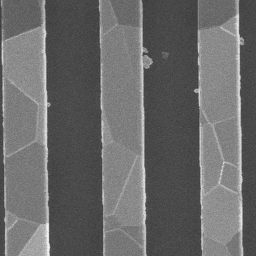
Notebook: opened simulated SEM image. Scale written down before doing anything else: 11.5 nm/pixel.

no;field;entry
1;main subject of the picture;lines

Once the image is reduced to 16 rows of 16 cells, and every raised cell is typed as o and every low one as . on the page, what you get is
ooo...ooo...ooo.
ooo...ooo...ooo.
ooo...ooo...ooo.
ooo...ooo...ooo.
ooo...ooo...ooo.
ooo...ooo...ooo.
ooo...ooo...ooo.
ooo...ooo....oo.
ooo...ooo....oo.
ooo...ooo....oo.
ooo...ooo....oo.
ooo...ooo....oo.
ooo...ooo....oo.
ooo...ooo....oo.
ooo...ooo....oo.
ooo...ooo....oo.